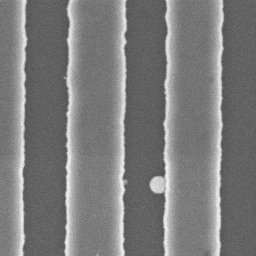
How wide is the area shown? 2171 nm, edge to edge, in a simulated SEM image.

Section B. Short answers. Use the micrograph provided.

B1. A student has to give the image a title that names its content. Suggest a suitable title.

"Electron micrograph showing lines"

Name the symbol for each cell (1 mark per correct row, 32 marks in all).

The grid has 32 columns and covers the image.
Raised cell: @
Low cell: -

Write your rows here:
@@@------@@@@@@@-----@@@@@@@----
@@@------@@@@@@@-----@@@@@@@----
@@@------@@@@@@@-----@@@@@@@----
@@@------@@@@@@@-----@@@@@@@----
@@@------@@@@@@@-----@@@@@@@----
@@@------@@@@@@@-----@@@@@@@----
@@@------@@@@@@@-----@@@@@@@----
@@@------@@@@@@@-----@@@@@@@----
@@@------@@@@@@@-----@@@@@@@----
@@@------@@@@@@@-----@@@@@@@----
@@@------@@@@@@@-----@@@@@@@----
@@@------@@@@@@@-----@@@@@@@----
@@@------@@@@@@@-----@@@@@@@----
@@@------@@@@@@@-----@@@@@@@----
@@@------@@@@@@@-----@@@@@@@----
@@@------@@@@@@------@@@@@@@----
@@@-----@@@@@@@------@@@@@@@----
@@@------@@@@@@------@@@@@@@----
@@@-----@@@@@@@@-----@@@@@@@----
@@@------@@@@@@@-----@@@@@@@----
@@@-----@@@@@@@------@@@@@@@----
@@@-----@@@@@@@------@@@@@@@----
@@@-----@@@@@@@------@@@@@@@----
@@@-----@@@@@@@@---@@@@@@@@-----
@@@-----@@@@@@@------@@@@@@-----
@@@-----@@@@@@@------@@@@@@-----
@@@-----@@@@@@@------@@@@@@@----
@@@-----@@@@@@@------@@@@@@@----
@@@-----@@@@@@@------@@@@@@-----
@@@-----@@@@@@@------@@@@@@-----
@@@-----@@@@@@@------@@@@@@-----
@@@-----@@@@@@@@-----@@@@@@-----